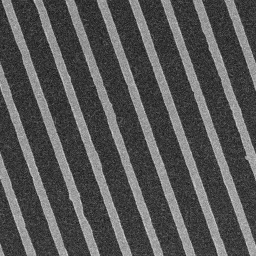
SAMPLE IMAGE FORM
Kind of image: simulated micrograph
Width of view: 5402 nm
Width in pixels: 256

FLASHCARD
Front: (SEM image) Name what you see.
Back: parallel lines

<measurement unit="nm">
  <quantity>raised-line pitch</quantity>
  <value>635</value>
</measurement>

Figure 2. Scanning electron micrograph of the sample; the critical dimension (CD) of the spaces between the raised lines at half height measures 468 nm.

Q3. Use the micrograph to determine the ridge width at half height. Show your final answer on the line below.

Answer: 172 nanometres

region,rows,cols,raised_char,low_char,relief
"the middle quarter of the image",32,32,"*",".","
......**......**......**......**
*.....***......*.......**.....**
*......**......**......**......*
**.....**......**......**......*
**......**......**.....**......*
**......**......**......**......
**......**......**......**......
.**......**......**......**.....
.**......**......**......**.....
.**......**......**......**.....
..**......**......**......**....
..**......**......**......**....
...**......**.....**......**....
...**......**......**......**...
...**......**......**......**...
...***.....**......**......**...
....**......**......**......**..
....**......**......**......**..
....**......***.....**......**..
.....**......**......**......**.
.....**......**......**......**.
......**......*......**.......*.
......**......**......**......**
......***.....**......**......**
*......**......*.......**......*
*......**......**......**......*
*......**......**......**......*
**......**......**......**......
**......**......**......**......
**......**......**......**......
.**......**......**......**.....
.**......**......**......**.....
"